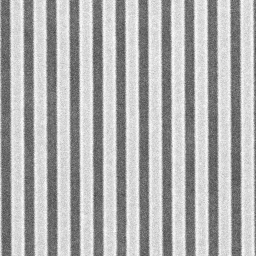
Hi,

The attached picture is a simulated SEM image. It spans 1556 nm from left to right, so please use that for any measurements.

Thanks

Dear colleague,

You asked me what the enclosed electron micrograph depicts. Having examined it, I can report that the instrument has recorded parallel lines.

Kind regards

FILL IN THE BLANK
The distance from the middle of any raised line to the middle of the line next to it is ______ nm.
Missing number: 140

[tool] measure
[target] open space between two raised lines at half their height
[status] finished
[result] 63.8 nm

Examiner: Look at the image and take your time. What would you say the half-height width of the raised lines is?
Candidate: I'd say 0.0745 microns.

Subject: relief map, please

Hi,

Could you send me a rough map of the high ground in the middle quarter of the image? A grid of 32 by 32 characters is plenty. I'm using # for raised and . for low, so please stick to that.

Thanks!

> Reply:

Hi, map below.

#...###...###...##...###...###..
#...###...###...##...###...###..
#...###...###...##...###...###..
#...###...###...##...###...###..
#...###...###...##...###...###..
#...###...###...##...###...###..
#...###...###...##...###...###..
#...###...###...##...###...###..
#...###...###...##...###...###..
#...###...###...##...###...###..
#...###...###...##...###...###..
#...###...###...##...###...###..
#...###...###...##...###...###..
#...###...###...##...###...###..
#...###...###...##...###...###..
#...###...###...##...###...###..
#...###...###...##...###...###..
#...###...###...##...###...###..
#...###...###...##...###...###..
#...###...###...##...###...###..
#...###...###...##...###...###..
#...###...###...##...###...###..
#...###...###...##...###...###..
#...###...###...##...###...###..
#...###...###...##...###...###..
#...###...###...##...###...###..
#...###...###...##...###...###..
#...###...###...##...###...###..
#...###...###...##...###...###..
#...###...###...###..###...###..
#...###...###...###..###...###..
#...###...###...###..###...###..